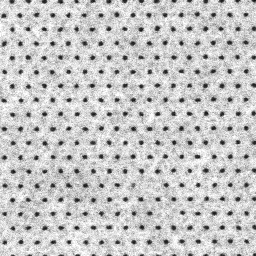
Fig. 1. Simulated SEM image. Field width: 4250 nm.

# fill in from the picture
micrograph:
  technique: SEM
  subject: a regular array of holes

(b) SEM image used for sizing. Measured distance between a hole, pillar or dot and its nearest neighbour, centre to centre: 0.262 µm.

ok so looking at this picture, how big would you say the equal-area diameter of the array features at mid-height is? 85.8 nm